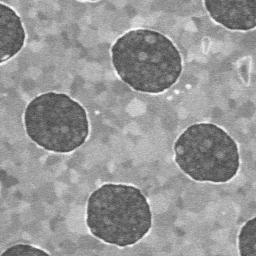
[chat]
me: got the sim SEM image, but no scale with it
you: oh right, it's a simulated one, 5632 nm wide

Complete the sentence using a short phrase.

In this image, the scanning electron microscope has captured holes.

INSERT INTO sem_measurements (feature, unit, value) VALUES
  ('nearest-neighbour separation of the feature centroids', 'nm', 2380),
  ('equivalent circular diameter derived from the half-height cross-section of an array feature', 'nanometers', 1400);